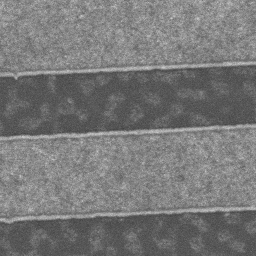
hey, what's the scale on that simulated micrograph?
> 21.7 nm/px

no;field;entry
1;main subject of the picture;one or a few lines or trenches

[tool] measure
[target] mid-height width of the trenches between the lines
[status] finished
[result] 1390 nm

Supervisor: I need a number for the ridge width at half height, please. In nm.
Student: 1760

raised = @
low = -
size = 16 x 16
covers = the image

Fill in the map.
@@@@@@@@@@@@@@@@
@@@@@@@@@@@@@@@@
@@@@@@@@@@@@@@@@
@@@@@@@@@@@@@@@@
@@@-------------
----------------
----------------
----------------
----@@@@@@@@@@@@
@@@@@@@@@@@@@@@@
@@@@@@@@@@@@@@@@
@@@@@@@@@@@@@@@@
@@@@@@@@@@@@@@@@
@@@@@-----------
----------------
----------------